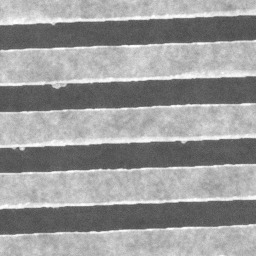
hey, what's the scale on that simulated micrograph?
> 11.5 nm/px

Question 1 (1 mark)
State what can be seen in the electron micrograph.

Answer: lines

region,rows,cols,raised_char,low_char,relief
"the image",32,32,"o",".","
oooooooooooooooooooooooooooooooo
oooooooooooooooooooooooooooooooo
ooooooooooooooo.................
................................
................................
....................oooooooooooo
oooooooooooooooooooooooooooooooo
oooooooooooooooooooooooooooooooo
oooooooooooooooooooooooooooooooo
oooooooooooooooooooooooooo......
ooooo.oo........................
................................
................................
.................ooooooooooooooo
oooooooooooooooooooooooooooooooo
oooooooooooooooooooooooooooooooo
oooooooooooooooooooooooooooooooo
oooooooooooooooooooooooo........
................................
................................
................................
......oooooooooooooooooooooooooo
oooooooooooooooooooooooooooooooo
oooooooooooooooooooooooooooooooo
oooooooooooooooooooooooooooooooo
oooooooooooooo..................
................................
................................
......................oooooooooo
oooooooooooooooooooooooooooooooo
oooooooooooooooooooooooooooooooo
oooooooooooooooooooooooooooooooo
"